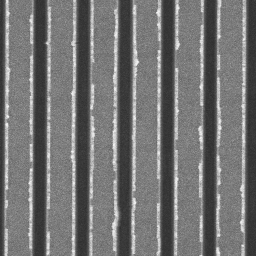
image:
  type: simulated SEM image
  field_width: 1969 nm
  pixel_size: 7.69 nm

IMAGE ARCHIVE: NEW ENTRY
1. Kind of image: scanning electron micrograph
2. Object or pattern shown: parallel lines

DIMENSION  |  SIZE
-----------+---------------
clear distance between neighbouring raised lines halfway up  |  99.9 nm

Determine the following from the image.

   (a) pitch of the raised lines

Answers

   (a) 0.326 micrometres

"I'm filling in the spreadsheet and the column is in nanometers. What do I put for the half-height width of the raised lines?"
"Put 229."